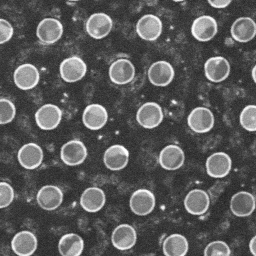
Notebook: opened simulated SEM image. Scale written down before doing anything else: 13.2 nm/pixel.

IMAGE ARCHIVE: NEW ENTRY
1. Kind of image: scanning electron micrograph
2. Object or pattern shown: a regular array of raised bodies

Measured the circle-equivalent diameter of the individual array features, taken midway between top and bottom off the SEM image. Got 313 nanometres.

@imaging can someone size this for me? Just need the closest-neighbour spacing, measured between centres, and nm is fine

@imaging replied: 566